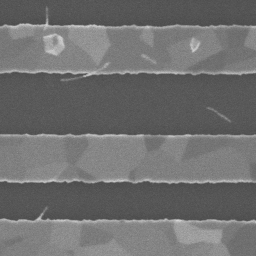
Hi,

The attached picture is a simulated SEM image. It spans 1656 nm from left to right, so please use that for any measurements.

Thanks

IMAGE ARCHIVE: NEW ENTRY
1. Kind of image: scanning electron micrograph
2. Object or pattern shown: lines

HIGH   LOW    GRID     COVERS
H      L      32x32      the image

LLLLLLLLLLLLLLLLLLLLLLLLLLLLLLLL
LLLLLLLLLLLLLLLLLLLLLLLLLLLLLLLL
LLLLLLLLLLLLLLLLLLLLLLLLLLLLLLLL
HHHHHHHHHHHHHHHHHHHHHHHHHHHHHHHH
HHHHHHHHHHHHHHHHHHHHHHHHHHHHHHHH
HHHHHHHHHHHHHHHHHHHHHHHHHHHHHHHH
HHHHHHHHHHHHHHHHHHHHHHHHHHHHHHHH
HHHHHHHHHHHHHHHHHHHHHHHHHHHHHHHH
HHHHHHHHHHHHHHHHHHHHHHHHHHHHHHHH
LLLLLLLLLLLLLLLLLLLLLLLLLLLLLLLL
LLLLLLLLLLLLLLLLLLLLLLLLLLLLLLLL
LLLLLLLLLLLLLLLLLLLLLLLLLLLLLLLL
LLLLLLLLLLLLLLLLLLLLLLLLLLLLLLLL
LLLLLLLLLLLLLLLLLLLLLLLLLLLLLLLL
LLLLLLLLLLLLLLLLLLLLLLLLLLLLLLLL
LLLLLLLLLLLLLLLLLLLLLLLLLLLLLLLL
LLLLLLLLLLLLLLLLLLLLLLLLLLLLLLLL
HHHHHHHHHHHHHHHHHHHHHHHHHHHHHHHH
HHHHHHHHHHHHHHHHHHHHHHHHHHHHHHHH
HHHHHHHHHHHHHHHHHHHHHHHHHHHHHHHH
HHHHHHHHHHHHHHHHHHHHHHHHHHHHHHHH
HHHHHHHHHHHHHHHHHHHHHHHHHHHHHHHH
HHHHHHHHHHHHHHHHHHHHHHHHHHHHHHHH
LLLLLLLLLLLLLLLLLLLLLLLLLLLLLLLL
LLLLLLLLLLLLLLLLLLLLLLLLLLLLLLLL
LLLLLLLLLLLLLLLLLLLLLLLLLLLLLLLL
LLLLLLLLLLLLLLLLLLLLLLLLLLLLLLLL
HLHHHHHHHLLLHHHHHHHHHHHLLLHLLLLL
HHHHHHHHHHHHHHHHHHHHHHHHHHHHHHHH
HHHHHHHHHHHHHHHHHHHHHHHHHHHHHHHH
HHHHHHHHHHHHHHHHHHHHHHHHHHHHHHHH
HHHHHHHHHHHHHHHHHHHHHHHHHHHHHHHH